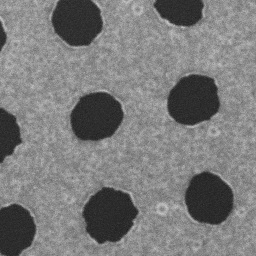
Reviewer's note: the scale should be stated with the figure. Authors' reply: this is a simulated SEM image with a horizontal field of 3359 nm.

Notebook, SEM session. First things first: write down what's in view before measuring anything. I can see holes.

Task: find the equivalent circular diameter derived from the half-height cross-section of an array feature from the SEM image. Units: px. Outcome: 52.9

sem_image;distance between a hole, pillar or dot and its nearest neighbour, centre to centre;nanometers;1300